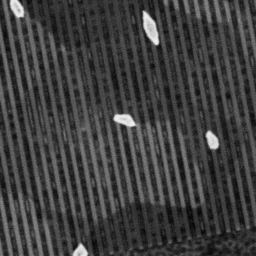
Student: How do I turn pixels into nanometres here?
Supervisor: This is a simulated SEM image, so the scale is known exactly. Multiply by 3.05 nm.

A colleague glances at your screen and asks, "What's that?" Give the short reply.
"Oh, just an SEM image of parallel lines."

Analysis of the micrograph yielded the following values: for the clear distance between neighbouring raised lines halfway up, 19.9 nm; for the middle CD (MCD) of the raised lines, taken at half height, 8.6 nanometers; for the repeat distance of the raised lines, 30.2 nanometers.